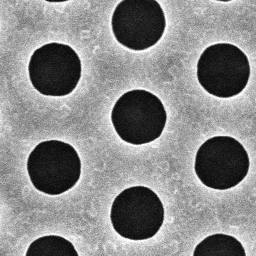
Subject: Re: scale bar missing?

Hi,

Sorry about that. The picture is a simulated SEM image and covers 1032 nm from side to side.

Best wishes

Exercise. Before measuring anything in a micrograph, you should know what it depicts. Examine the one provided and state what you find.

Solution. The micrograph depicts holes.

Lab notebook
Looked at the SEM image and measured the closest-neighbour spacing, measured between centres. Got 383 nm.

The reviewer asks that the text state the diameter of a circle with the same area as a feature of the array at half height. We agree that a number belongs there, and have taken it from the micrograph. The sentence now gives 0.22 um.